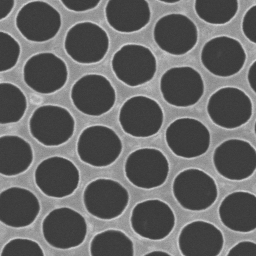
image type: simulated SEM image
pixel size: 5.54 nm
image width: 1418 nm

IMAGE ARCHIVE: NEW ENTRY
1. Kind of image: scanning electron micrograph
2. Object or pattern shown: a regular array of holes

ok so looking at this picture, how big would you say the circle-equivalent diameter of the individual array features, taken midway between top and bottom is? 231 nanometers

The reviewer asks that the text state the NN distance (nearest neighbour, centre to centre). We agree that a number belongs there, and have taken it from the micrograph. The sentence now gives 51.1 px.